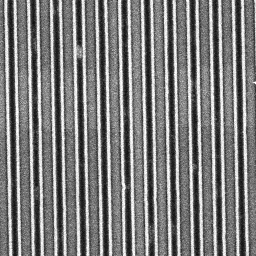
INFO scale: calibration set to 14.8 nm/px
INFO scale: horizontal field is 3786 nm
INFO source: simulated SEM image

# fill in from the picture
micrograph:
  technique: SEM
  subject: parallel lines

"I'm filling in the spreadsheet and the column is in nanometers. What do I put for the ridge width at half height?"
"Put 139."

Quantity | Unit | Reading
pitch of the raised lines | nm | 336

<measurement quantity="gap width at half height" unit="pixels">12.7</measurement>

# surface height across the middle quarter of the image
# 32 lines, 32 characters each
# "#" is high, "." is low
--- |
...##....##...##....##....##...#
...##....##...##....##....##...#
...##....##...##....##....##...#
...##....##...##....##....##...#
...##....##...##....##....##...#
...##....##...###...##....##...#
...##....##...###...##....##...#
...##....##...###...##....##...#
...##....##...###...##....##...#
...##....##...###...##....##...#
...##....##....##...##....##...#
...##....##....##...##....##...#
...##....##....##...##....##....
...##....##....##...##....##....
...##....##....##...##....##....
...##....##....##...##....##....
...##....##....##...##....##....
...##....##....##...##....##....
...##....##....##...##....##....
...##....##....##...###...##....
...##....##....##...###...##....
...##....##....##...###...##....
...##....##....##...###...##....
...##....##....##...###...##....
...##....##....##...###...##....
...##....##....##...###...##....
...##....##....##...###...##....
...##....##....##...###...##....
...###...##....##...###...##....
...###...##....##...###...##....
...###...##....##...###...##....
...###...##....##...###...##....